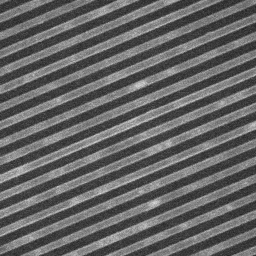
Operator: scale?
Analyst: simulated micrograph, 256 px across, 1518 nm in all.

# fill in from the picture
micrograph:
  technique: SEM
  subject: parallel lines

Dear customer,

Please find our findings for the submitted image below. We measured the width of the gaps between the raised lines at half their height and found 55.3 nm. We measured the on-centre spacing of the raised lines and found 97.6 nm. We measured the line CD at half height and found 40.3 nm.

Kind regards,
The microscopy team